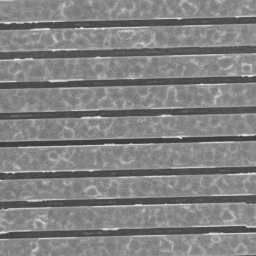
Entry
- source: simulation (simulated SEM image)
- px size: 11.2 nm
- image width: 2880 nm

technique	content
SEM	parallel lines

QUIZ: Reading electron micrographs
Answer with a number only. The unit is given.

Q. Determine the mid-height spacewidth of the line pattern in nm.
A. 77.3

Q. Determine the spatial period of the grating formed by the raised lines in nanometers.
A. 336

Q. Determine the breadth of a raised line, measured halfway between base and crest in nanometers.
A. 256